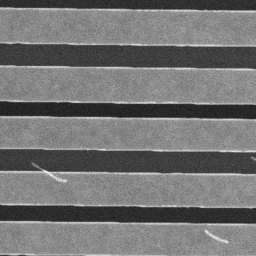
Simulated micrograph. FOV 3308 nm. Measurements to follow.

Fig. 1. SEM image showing lines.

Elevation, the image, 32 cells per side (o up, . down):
................................
oooooooooooooooooooooooooooooooo
oooooooooooooooooooooooooooooooo
oooooooooooooooooooooooooooooooo
oooooooooooooooooooooooooooooooo
........oooooooooooooooooooooooo
................................
................................
ooooooooooooooooo...............
oooooooooooooooooooooooooooooooo
oooooooooooooooooooooooooooooooo
oooooooooooooooooooooooooooooooo
oooooooooooooooooooooooooooooooo
................................
................................
oooooooooooooooooooooooooooooooo
oooooooooooooooooooooooooooooooo
oooooooooooooooooooooooooooooooo
oooooooooooooooooooooooooooooooo
................................
................................
oooooo..........................
oooooooooooooooooooooooooooooooo
oooooooooooooooooooooooooooooooo
oooooooooooooooooooooooooooooooo
oooooooooooooooooooooooooooooooo
................................
................................
oooooooooooooooooooooooooooooooo
oooooooooooooooooooooooooooooooo
oooooooooooooooooooooooooooooooo
oooooooooooooooooooooooooooooooo